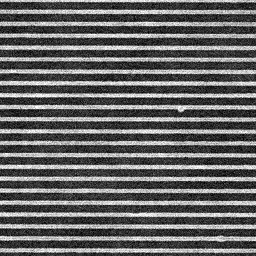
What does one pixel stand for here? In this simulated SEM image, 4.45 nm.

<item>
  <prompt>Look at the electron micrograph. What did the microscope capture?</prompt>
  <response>parallel lines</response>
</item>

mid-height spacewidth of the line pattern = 40.1 nanometers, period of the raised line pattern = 53.1 nm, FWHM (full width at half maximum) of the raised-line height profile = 0.0122 microns